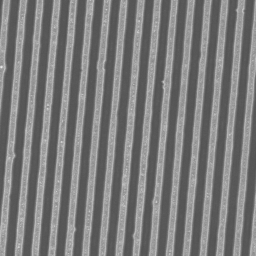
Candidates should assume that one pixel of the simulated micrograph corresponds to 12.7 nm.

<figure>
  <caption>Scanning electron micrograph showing parallel lines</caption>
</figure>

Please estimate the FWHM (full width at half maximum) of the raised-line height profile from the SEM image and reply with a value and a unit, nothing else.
0.101 um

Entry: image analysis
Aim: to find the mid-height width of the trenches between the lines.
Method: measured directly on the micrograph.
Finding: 112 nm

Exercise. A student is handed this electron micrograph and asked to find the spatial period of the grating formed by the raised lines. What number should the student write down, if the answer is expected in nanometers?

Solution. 212